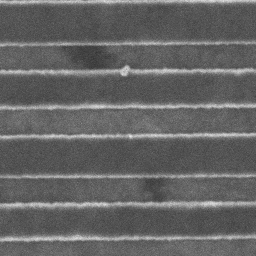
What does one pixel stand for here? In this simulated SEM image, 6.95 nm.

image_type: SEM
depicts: lines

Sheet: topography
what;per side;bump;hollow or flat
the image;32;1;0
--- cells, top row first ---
11111111111111111111111111111111
11111111111111111111111111111111
11111111111111111111111111111111
11111111111111111111111111111111
11111111111111111111111111111111
11111111111111100010100000000000
00000000000000000000000000000000
00000000000000000000000000000000
00000000000000010000000000000000
11111111111111111111111111111111
11111111111111111111111111111111
11111111111111111111111111111111
11111111111111111111111111111111
11111110110000000000000000000000
00000000000000000000000000000000
00000000000000000000000000000000
00000000000000000000000000000000
11111111111111111111111111111111
11111111111111111111111111111111
11111111111111111111111111111111
11111111111111111111111111111111
11111111111111111111111111111111
00000000000000000000000000000000
00000000000000000000000000000000
00000000000000000000000000000000
11111111111111111111111111111111
11111111111111111111111111111111
11111111111111111111111111111111
11111111111111111111111111111111
11111111111111111111111111111111
00000000000000000000000000000000
00000000000000000000000000000000